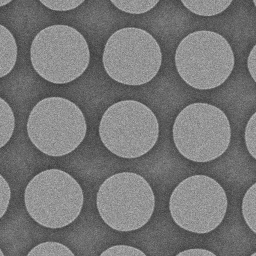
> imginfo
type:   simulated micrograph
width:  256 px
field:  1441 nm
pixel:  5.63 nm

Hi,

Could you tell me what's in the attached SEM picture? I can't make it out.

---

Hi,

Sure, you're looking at an array of small figures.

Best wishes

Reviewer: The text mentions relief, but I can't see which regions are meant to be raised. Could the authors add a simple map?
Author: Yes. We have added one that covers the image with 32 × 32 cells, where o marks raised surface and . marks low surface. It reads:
o....ooooo....ooooo....oooooo...
................oo......oooo....
................................
o.....ooo.......o...............
oo...ooooo....ooooo.....oooo....
oo..ooooooo..ooooooo...oooooo...
oo..ooooooo..ooooooo..ooooooo..o
oo..ooooooo..ooooooo..ooooooo..o
oo..ooooooo..ooooooo..ooooooo..o
.....ooooo....ooooo....ooooo...o
................oo......ooo.....
................................
.....ooo........................
o...oooooo....ooooo....oooo.....
oo..oooooo...oooooo...oooooo....
oo.oooooooo.oooooooo..ooooooo..o
oo..ooooooo.oooooooo..ooooooo..o
o...oooooo...ooooooo..ooooooo..o
.....oooo....oooooo...oooooo...o
...............oo......oooo.....
................................
.....ooo........................
o...ooooo....ooooo.....oooo.....
o..ooooooo...oooooo...oooooo...o
o..ooooooo..ooooooo..ooooooo...o
o..ooooooo..ooooooo..ooooooo..oo
o...oooooo..ooooooo..ooooooo..oo
....ooooo....ooooo....oooooo...o
..............ooo......oooo....o
................................
.....oo.........................
....ooooo....ooooo.....ooo......